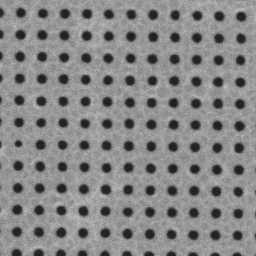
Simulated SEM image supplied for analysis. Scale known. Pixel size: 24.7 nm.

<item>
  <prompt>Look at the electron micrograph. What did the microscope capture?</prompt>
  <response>a regular array of holes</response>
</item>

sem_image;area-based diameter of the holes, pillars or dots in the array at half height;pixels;10.1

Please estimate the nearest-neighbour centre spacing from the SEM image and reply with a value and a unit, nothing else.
537 nm